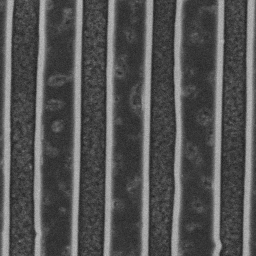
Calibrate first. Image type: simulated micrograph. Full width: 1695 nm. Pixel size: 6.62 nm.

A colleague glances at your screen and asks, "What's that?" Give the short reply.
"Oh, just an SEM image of one or a few lines or trenches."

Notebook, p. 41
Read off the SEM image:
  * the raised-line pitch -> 462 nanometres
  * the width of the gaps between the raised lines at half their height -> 203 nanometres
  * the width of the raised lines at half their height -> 260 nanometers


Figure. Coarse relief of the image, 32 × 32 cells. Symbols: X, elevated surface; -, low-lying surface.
X----XXXXX----XXXXX---XXXXXX---X
X----XXXXX----XXXXX---XXXXXX---X
X----XXXXX----XXXXX---XXXXXX---X
X----XXXXX----XXXXX---XXXXXX---X
X----XXXXX----XXXXX---XXXXXX---X
X----XXXXX----XXXXX---XXXXXX---X
X----XXXXX----XXXXX---XXXXX----X
X----XXXXX----XXXXX---XXXXX----X
X----XXXXX----XXXX----XXXXX----X
X----XXXXX----XXXX----XXXXX----X
X----XXXXX----XXXX----XXXXX----X
X----XXXXX----XXXX----XXXXX----X
X----XXXXX----XXXX----XXXXX----X
X----XXXXX----XXXX----XXXXX----X
X----XXXXX----XXXX----XXXXX----X
X----XXXXX----XXXX----XXXXX----X
X----XXXXX----XXXX----XXXXX----X
X----XXXXX----XXXX----XXXXX----X
X----XXXXX----XXXX----XXXXX----X
X----XXXXX----XXXX----XXXXX----X
X----XXXXX----XXXX----XXXXX----X
X----XXXXX----XXXX----XXXXX----X
X----XXXXX----XXXX----XXXXX----X
X----XXXXX----XXXX----XXXXX----X
X----XXXXX----XXXX----XXXXX----X
X----XXXX-----XXXX----XXXXX----X
X----XXXX-----XXXX----XXXXX----X
X----XXXX-----XXXX----XXXXX----X
X----XXXX-----XXXX----XXXXX----X
X----XXXX----XXXXX----XXXXX----X
X----XXXX----XXXXX----XXXXX----X
X----XXXX----XXXXX----XXXXX----X